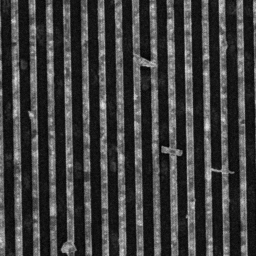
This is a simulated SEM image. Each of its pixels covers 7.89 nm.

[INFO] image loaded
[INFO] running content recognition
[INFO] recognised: parallel lines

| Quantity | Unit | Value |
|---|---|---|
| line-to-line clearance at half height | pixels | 11.6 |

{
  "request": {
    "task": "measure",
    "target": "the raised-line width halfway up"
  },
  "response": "49.3 nanometers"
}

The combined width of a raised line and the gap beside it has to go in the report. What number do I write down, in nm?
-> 137